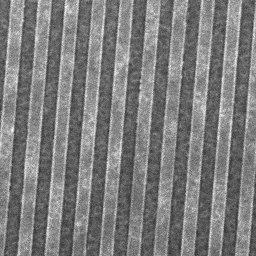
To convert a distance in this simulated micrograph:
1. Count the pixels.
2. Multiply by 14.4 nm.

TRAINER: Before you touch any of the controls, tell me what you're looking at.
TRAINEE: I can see parallel lines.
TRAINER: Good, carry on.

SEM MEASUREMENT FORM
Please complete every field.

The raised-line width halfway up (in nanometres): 183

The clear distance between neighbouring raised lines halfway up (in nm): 208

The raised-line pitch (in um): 0.39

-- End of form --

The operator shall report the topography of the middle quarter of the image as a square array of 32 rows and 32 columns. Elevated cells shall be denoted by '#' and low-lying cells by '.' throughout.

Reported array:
##....###....###....###...###...
##....###....###....###...###...
##....###....###...###....###...
##....###....###...###....###...
##....###...###....###....###...
##....###...###....###....###...
##...###....###....###....###...
##...###....###....###....###...
#....###....###....###....###...
#....###....###....###....###...
#....###....###....###....###...
#....###....###....###....###...
#....###....###....###...###....
#....###....###....###...###....
#....###....###...###....###....
#....###....###...###....###....
#....###....##....###....###....
#....###....##....###....###....
#...###.....##....###....###....
#...###....###....###....###....
#...###....###....###....###....
....###....###....###....###....
....###....###....###....###...#
....###....###....###....###...#
....###....###....###...###....#
....###....###....###...###....#
....###....###...####...###....#
....###....###...###....###....#
....###....###...###....###....#
....###....##....###....###....#
....###....##....###....###....#
...###....###....###....###....#